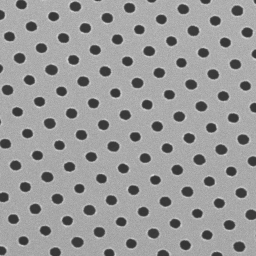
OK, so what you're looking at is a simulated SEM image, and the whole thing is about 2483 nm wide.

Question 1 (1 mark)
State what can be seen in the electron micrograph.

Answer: a regular array of holes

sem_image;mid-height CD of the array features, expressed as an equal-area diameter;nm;106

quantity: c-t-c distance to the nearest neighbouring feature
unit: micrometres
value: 0.231